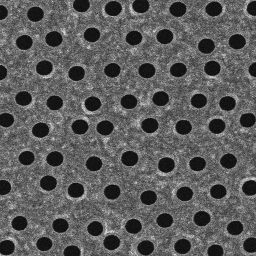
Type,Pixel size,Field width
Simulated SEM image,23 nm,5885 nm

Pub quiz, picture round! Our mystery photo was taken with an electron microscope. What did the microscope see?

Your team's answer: a regular array of holes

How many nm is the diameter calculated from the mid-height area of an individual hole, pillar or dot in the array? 369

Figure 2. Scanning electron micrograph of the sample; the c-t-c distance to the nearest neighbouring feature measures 694 nanometers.